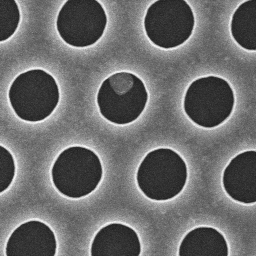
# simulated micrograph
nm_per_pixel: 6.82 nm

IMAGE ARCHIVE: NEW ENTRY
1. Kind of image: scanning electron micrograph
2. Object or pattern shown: holes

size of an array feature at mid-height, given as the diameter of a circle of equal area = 348 nm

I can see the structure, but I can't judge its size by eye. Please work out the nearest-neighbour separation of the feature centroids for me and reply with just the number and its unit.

588 nanometres